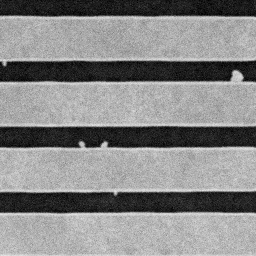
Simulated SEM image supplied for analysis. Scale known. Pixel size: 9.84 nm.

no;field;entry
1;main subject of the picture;wiring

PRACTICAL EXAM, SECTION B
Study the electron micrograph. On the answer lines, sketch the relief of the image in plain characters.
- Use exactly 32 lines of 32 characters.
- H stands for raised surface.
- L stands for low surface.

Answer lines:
LLLLLLLLLLLLLLLLLLLLLLLLLLLLLLLL
LLLLLLLLLLLLLLLLLLLLLLLLLLLLLLLL
HHHHHHHHHHHHHHHHHHHHHHHHHHHHHHHH
HHHHHHHHHHHHHHHHHHHHHHHHHHHHHHHH
HHHHHHHHHHHHHHHHHHHHHHHHHHHHHHHH
HHHHHHHHHHHHHHHHHHHHHHHHHHHHHHHH
HHHHHHHHHHHHHHHHHHHHHHHHHHHHHHHH
HHHHHHHHHLHHHHHLLLLLHHHHHHHHHHHL
LLLLLLLLLLLLLLLLLLLLLLLLLLLLLLLL
LLLLLLLLLLLLLLLLLLLLLLLLLLLLLHLL
HHHHHHHHHHHHHHHHHHHHHHHHHHHHHHHH
HHHHHHHHHHHHHHHHHHHHHHHHHHHHHHHH
HHHHHHHHHHHHHHHHHHHHHHHHHHHHHHHH
HHHHHHHHHHHHHHHHHHHHHHHHHHHHHHHH
HHHHHHHHHHHHHHHHHHHHHHHHHHHHHHHH
HHHHHHHHHHHHHHHHHHHHHHHHHHHHHHHH
LLLLLLLLLLLLLLLLLLLLLLLLLLLLLLLL
LLLLLLLLLLLLLLLLLLLLLLLLLLLLLLLL
LLLLLLLLLLLLHHLLLLLLLLLLLLLHHHHH
HHHHHHHHHHHHHHHHHHHHHHHHHHHHHHHH
HHHHHHHHHHHHHHHHHHHHHHHHHHHHHHHH
HHHHHHHHHHHHHHHHHHHHHHHHHHHHHHHH
HHHHHHHHHHHHHHHHHHHHHHHHHHHHHHHH
HHHHHHHHHHHHHHHHHHHHHHHHHHHHHHHH
LLLLLLLLLLLLLLLLLLLLLLLLLLLLLLLL
LLLLLLLLLLLLLLLLLLLLLLLLLLLLLLLL
LLLLLLLLLLLLLLLLLLLLLLLLLLLLLLLL
HHHHHHHHHHHHHHHHHHHHHHHHHHHHHHHH
HHHHHHHHHHHHHHHHHHHHHHHHHHHHHHHH
HHHHHHHHHHHHHHHHHHHHHHHHHHHHHHHH
HHHHHHHHHHHHHHHHHHHHHHHHHHHHHHHH
HHHHHHHHHHHHHHHHHHHHHHHHHHHHHHHH